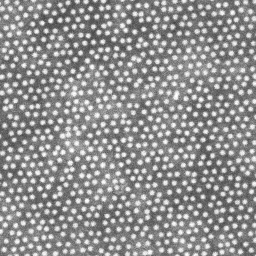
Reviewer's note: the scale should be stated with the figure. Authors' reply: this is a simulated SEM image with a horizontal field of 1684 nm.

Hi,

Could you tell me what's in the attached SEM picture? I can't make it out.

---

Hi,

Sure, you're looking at a regular array of raised bodies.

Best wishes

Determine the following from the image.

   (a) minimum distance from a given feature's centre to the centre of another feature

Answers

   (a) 0.0513 um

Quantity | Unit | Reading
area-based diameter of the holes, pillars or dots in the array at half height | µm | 0.0278